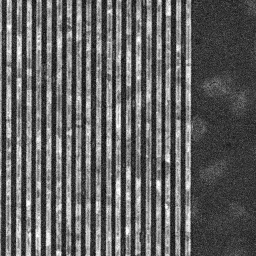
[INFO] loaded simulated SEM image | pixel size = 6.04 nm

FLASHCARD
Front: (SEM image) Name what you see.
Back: parallel lines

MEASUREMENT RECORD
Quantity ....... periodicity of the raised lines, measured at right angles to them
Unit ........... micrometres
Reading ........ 0.0603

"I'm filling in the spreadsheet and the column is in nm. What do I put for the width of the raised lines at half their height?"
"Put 20.4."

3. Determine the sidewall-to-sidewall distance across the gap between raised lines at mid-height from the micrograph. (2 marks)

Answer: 40.8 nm